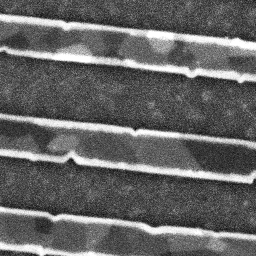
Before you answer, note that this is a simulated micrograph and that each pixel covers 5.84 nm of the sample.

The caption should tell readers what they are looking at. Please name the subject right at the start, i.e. one or a few lines or trenches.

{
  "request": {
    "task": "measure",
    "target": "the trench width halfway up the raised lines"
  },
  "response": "348 nm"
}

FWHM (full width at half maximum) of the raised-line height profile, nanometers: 216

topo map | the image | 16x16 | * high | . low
................
****............
**************..
..**************
...........*****
................
................
***.............
************....
****************
........********
................
................
***.............
*************...
****************